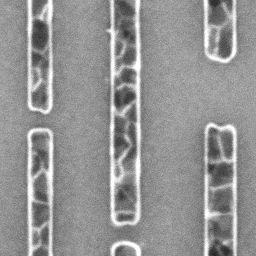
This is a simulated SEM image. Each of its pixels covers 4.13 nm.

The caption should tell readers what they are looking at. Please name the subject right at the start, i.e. one or a few lines or trenches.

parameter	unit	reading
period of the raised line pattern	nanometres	367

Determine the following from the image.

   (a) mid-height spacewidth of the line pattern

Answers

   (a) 258 nanometers